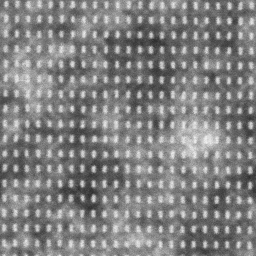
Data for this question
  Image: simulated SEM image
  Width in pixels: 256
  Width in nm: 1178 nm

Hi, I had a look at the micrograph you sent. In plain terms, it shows a regular array of raised bodies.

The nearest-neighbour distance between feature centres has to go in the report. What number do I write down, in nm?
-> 50.6